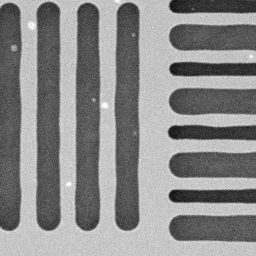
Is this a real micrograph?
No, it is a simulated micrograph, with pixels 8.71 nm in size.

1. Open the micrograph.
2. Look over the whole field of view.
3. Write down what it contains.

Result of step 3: groups of lines, slits or small figures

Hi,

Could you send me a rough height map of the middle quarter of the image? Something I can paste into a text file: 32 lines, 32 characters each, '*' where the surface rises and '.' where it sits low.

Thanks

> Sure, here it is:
***......****......*******......
***......****......*******......
***......****......********.....
***......****......*************
***......****......*************
***......****......*************
***......****......*********....
***......****......********.....
***......***.......*******......
***......***.......*******......
***......***.......*******......
***......***.......********.....
***......***.......*********....
***......****......*************
***......****......*************
***......****......********.....
***......****......*******......
***......****......*******......
***......****......********.....
***......****......*************
***......****......*************
***......****......*************
***......****......*********....
***......****......********.....
***......****......*******......
***......****......*******......
***......****......*******......
***......****......********.....
***......****......**********...
***......****......*************
***......****......*************
***......****......********.....